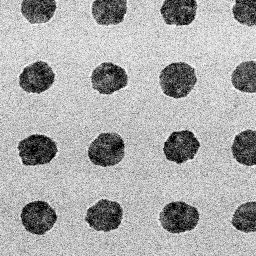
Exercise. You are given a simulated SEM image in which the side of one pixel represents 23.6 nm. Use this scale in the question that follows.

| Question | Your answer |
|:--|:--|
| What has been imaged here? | a regular array of raised bodies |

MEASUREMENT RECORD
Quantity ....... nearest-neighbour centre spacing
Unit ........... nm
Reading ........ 1580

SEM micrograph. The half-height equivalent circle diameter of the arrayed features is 845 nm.